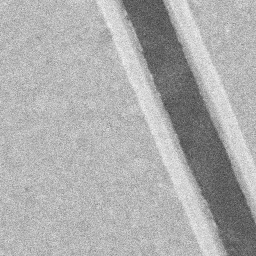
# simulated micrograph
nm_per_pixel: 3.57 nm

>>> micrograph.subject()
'one or a few lines or trenches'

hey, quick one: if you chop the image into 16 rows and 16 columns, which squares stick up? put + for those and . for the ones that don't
+++++++....+++++
+++++++.....++++
++++++++....++++
++++++++.....+++
++++++++.....+++
+++++++++....+++
+++++++++.....++
++++++++++....++
++++++++++.....+
++++++++++.....+
+++++++++++.....
+++++++++++.....
++++++++++++....
++++++++++++....
+++++++++++++...
+++++++++++++...